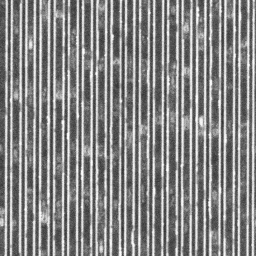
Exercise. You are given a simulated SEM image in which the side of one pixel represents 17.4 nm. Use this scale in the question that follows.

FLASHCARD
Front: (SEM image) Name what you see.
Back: parallel lines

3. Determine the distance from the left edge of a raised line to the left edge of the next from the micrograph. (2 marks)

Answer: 248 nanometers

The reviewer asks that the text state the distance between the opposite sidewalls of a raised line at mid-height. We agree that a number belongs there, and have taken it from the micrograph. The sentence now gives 170 nanometers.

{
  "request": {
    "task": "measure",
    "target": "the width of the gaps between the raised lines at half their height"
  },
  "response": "76.3 nm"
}